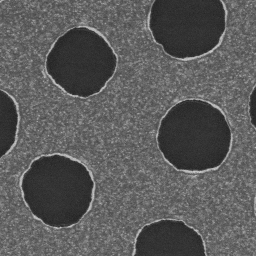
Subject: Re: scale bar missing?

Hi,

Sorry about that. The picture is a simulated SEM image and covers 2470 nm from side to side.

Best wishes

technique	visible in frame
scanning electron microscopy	holes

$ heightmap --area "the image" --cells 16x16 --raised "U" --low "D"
UUUUUUUUUDDDDDUU
UUUUUUUUUDDDDDUU
UUUUDDDUUUDDDDUU
UUUDDDDUUUUDUUUU
UUUDDDDUUUUUUUUU
UUUUDDUUUUUUUUUU
DUUUUUUUUUUDDUUU
DUUUUUUUUUDDDDUU
DUUUUUUUUUDDDDUU
UUUUUUUUUUDDDDUU
UUDDDUUUUUUDDUUU
UDDDDDUUUUUUUUUU
UUDDDDUUUUUUUUUU
UUDDDUUUUUUUUUUU
UUUUUUUUUDDDUUUU
UUUUUUUUDDDDDUUU